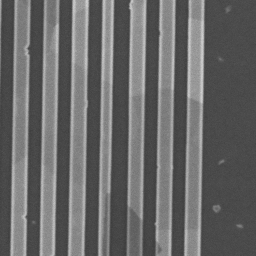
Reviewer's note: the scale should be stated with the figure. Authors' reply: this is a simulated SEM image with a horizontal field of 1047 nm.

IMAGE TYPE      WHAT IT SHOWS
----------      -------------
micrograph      parallel lines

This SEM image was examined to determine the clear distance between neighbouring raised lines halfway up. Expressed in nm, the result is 63.9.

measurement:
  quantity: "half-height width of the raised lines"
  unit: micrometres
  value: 0.0532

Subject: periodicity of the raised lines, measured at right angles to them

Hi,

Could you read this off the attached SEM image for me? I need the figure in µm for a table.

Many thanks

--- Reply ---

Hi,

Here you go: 0.119